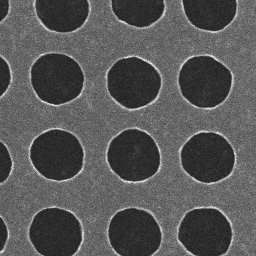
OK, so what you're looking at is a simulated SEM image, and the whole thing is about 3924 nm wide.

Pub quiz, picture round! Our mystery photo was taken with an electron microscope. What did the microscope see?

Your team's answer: holes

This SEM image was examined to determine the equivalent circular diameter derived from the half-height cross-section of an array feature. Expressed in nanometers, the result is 802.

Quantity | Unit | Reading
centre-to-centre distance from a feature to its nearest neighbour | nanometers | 1130